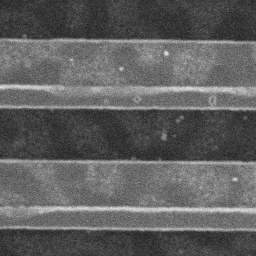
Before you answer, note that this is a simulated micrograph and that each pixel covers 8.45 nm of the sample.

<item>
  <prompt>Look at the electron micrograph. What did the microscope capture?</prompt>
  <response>lines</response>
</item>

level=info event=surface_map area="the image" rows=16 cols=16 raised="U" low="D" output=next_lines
DDDDDDDDDDDDDDDD
DDDDDDDDDDDDDDDD
DDDDDDDDDDDDDDDD
UUUUUUUUUUUUUUUU
UUUUUUUUUUUUUUUU
UUUUUUUUUUUUUUUU
UUUUUUUUUUUUUUUU
DDDDDDDDDDDDDDDD
DDDDDDDDDDDDDDDD
DDDDDDDDDDDDDDDD
UUUUUUUUUUUUUUUU
UUUUUUUUUUUUUUUU
UUUUUUUUUUUUUUUU
UUUUUUUUUUUUUUUU
DDDDDDDDDDDDDDDD
DDDDDDDDDDDDDDDD